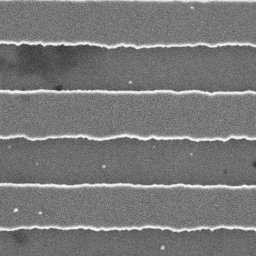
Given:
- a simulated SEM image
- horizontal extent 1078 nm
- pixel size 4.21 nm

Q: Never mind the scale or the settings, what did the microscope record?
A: lines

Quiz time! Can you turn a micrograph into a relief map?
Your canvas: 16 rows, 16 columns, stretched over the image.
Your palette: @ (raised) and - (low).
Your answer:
@@@@@@@@@@@@@@@@
@@@@@@@@@@@@@@@@
@@@@@@@@@@@@@@@@
----------------
----------------
----------------
@@@@@@@@@@@@@@@@
@@@@@@@@@@@@@@@@
@@@@@@@@@@@@@@@@
----------------
----------------
----------------
@@@@@@@@@@@@@@@@
@@@@@@@@@@@@@@@@
----------------
----------------